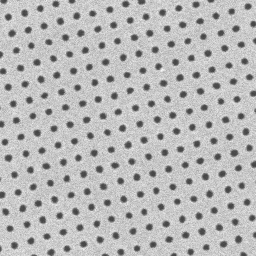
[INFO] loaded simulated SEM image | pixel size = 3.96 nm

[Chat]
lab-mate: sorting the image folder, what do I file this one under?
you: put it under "a regular array of holes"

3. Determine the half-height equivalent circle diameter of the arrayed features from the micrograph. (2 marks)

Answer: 26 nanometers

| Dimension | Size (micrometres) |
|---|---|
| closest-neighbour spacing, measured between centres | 0.0644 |